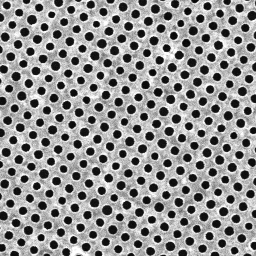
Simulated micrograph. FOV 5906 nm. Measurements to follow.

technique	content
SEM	a regular array of holes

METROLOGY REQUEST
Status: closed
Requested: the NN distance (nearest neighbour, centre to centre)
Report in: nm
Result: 325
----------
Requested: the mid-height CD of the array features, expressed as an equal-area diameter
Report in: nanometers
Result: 202